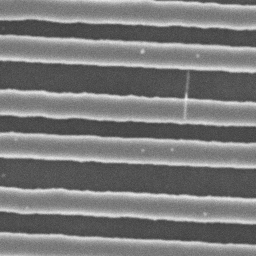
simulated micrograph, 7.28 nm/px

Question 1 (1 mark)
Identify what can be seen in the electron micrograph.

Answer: lines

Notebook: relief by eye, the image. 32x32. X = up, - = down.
XXXXXXXXXXXXXXXXXXXXXXXXXXX-----
XXXXXXXXXXXXXXXXXXXXXXXXXXXXXXXX
-----XXXXXXXXXXXXXXXXXXXXXXXXXXX
----------------------------XXXX
XX------------------------------
XXXXXXXXXXXXXXXXXXXXXXX---------
XXXXXXXXXXXXXXXXXXXXXXXXXXXXXXXX
--XXXXXXXXXXXXXXXXXXXXXXXXXXXXXX
---------------------XXXXXXXXXXX
--------------------------------
--------------------------------
XXXXXX--------------------------
XXXXXXXXXXXXXXXXXXXXXXXXX-------
XXXXXXXXXXXXXXXXXXXXXXXXXXXXXXXX
--X--XXXXXXXXXXXXXXXXXXXXXXXXXXX
--------------------------XXXXXX
--------------------------------
XXXXXXXXXXXXXXXXXXXXX-----------
XXXXXXXXXXXXXXXXXXXXXXXXXXXXXXXX
XXXXXXXXXXXXXXXXXXXXXXXXXXXXXXXX
-------------------XXXXXXXXXXXXX
--------------------------------
--------------------------------
XX------------------------------
XXXXXXXXXXXXXXXXXXXXXXX---------
XXXXXXXXXXXXXXXXXXXXXXXXXXXXXXXX
--XXXXXXXXXXXXXXXXXXXXXXXXXXXXXX
-----------------------XXXXXXXXX
--------------------------------
XXXXXXXXX-----------------------
XXXXXXXXXXXXXXXXXXXXXXXXXXX-----
XXXXXXXXXXXXXXXXXXXXXXXXXXXXXXXX